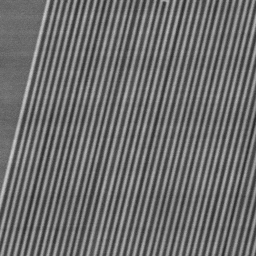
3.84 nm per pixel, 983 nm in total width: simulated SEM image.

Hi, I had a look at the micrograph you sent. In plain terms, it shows parallel lines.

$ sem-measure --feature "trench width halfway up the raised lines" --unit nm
13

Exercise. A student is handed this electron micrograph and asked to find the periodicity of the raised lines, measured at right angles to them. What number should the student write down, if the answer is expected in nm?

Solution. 24.7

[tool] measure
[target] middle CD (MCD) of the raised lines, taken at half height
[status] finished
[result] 9.8 nm